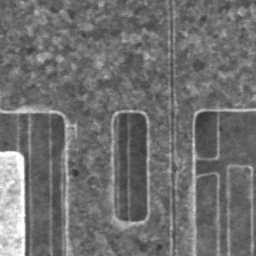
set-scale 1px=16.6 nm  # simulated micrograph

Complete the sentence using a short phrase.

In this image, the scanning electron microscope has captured wiring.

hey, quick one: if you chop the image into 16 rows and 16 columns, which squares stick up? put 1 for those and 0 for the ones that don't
1111111111111111
1111111111111111
1111111111111111
1111111111111111
1111111111111111
1111111111111111
1111111111111111
0000111001110000
0000111001110000
0000111001110000
1000111001110000
1000111001110000
1000111001110000
1000111001110000
1000111111110000
1000111111110000